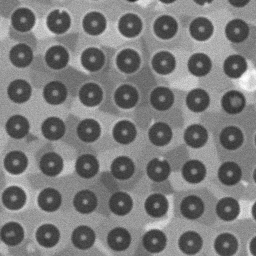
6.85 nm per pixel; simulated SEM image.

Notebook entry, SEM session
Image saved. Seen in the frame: an array of small figures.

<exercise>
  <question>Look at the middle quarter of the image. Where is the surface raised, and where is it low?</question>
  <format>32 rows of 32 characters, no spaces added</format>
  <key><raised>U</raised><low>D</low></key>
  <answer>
DUUUDDDDDDUUUDDDDDDUUUDDDDDDUUUD
UUUUUDDDDUUUUUDDDDDUUUDDDDDDUUUD
UUUUUUUUUUUUUUUDDUUUUUUDDDDUUUUU
UUUUUUUUUUUUUUUUUUUUUUUUUUUUUUUU
UUUUUUDUUUUUUUUUUUUUUUUUUUUUUUUU
UUUUDDDDDUUUUUDDDUUUUUUUDUUUUUUU
DUUUDDDDDDUUUDDDDDUUUUDDDDDUUUUU
DUUDDDDDDDUUDDDDDDDUUUDDDDDUUUUD
DUUUDDDDDDUUDDDUDDDUUDDDUDDDUUDD
UUUUDDDDDUUUUDDDDDDUUUDDDDDDUUDD
UUUUUDDDUUUUUDDDDDUUUUDDDDDUUUUD
UUUUUUUUUUUUUUUDUUUUUUUDDDUUUUUD
UUUUUUUUUUUUUUUUUUUUUUUUUUUUUUUU
UUUUUUDUUUUUUUUUUUUUUUUUUUUUUUUU
UUUUDDDDDUUUUDDDDUUUUUUUDUUUUUUU
UUUDDDDDDUUUDDDDDDUUUUDDDDUUUUUD
UUUDDDUDDUUUDDDDDDUUUDDDDDDUUUDD
UUUDDDDDDUUUDDDDDDUUUDDDDDDUUUDD
UUUUDDDDDUUUDDDDDDUUUDDDDDDUUUDD
UUUUUDDDUUUUUDDDDUUUUUDDDDUUUUDD
UUUUUUUUUUUUUUUUUUUUUUUDDUUUUUUD
UUUUUUUUUUUUUUUUUUUUUUUUUUUUUUUU
UUUUUDUUUUUUUUUUUUUUUUUUUUUUUUUU
UUUDDDDDUUUUUDDDDUUUUUUDUUUUUUUU
UUUDDDDDDUUUDDDDDUUUUDDDDDUUUUDD
UUUDDUDDDUUUDDDDDDUUUDDDDDDUUUDD
UUUDDDDDDUUUDDDDDDUUDDDUDDDUUDDD
UUUDDDDDUUUUDDDDDUUUUDDDDDDUUDDD
UUUUUDDUUUUUUDDDDUUUUDDDDDUUUUDD
UUUUUUUUUUUUUUUUUUUUUUUDDUUUUUUD
UUUUUUUUUUUUUUUUUUUUUUUUUUUUUUUU
UUUUDDUUUUUUUUUUUUUUUUUUUUUUUUUU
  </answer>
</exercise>